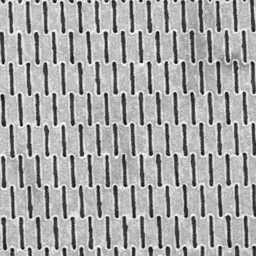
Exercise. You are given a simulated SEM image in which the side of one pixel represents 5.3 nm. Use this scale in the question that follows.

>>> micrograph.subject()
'a regular array of holes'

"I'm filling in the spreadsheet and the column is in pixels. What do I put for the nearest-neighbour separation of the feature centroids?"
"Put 17.1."